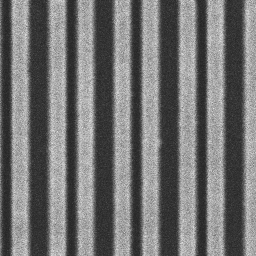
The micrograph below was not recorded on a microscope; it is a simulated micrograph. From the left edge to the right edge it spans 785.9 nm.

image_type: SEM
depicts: parallel lines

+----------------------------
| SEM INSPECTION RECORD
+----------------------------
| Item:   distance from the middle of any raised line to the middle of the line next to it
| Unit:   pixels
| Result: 32.5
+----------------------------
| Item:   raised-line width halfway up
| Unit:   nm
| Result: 56.3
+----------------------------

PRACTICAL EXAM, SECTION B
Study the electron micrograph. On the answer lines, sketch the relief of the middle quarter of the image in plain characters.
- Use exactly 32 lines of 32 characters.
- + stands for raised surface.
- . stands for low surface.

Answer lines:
+..+++++.....++++..+++++.....+++
+..+++++.....++++..+++++.....+++
+..+++++.....++++..+++++.....+++
+..+++++.....++++..+++++.....+++
+..+++++.....++++...++++.....+++
+..+++++.....++++...++++.....+++
+..+++++.....++++..+++++.....+++
+..+++++.....++++..+++++.....+++
+..+++++.....++++..+++++.....+++
+..++++......++++..+++++.....+++
+..++++......++++..+++++.....+++
+..+++++.....++++..+++++.....+++
+..+++++.....++++..+++++.....+++
+..+++++.....++++..+++++.....+++
+..+++++.....++++..+++++.....+++
+..+++++.....++++...++++.....+++
+..+++++.....++++...++++.....+++
+..+++++.....++++..+++++.....+++
+..++++......++++..+++++.....+++
+..++++......++++..+++++.....+++
+..++++......++++..+++++.....+++
+..+++++.....++++..+++++.....+++
+..+++++.....++++..+++++.....+++
+..+++++.....++++..+++++.....+++
+..+++++.....++++...++++.....+++
+..+++++.....++++...++++.....+++
+..+++++.....++++...++++.....+++
+..+++++.....++++..+++++.....+++
+..+++++.....++++..+++++.....+++
+..+++++.....++++...++++.....+++
+..+++++.....++++..+++++.....+++
+..+++++.....++++..+++++.....+++